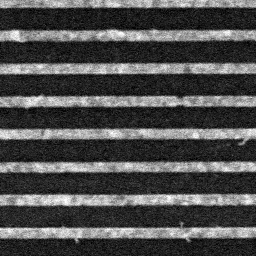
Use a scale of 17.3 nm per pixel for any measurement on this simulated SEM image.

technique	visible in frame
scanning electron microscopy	parallel lines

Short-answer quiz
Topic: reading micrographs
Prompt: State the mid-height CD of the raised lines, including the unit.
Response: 162 nanometres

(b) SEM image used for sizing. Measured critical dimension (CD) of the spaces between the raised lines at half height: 404 nanometers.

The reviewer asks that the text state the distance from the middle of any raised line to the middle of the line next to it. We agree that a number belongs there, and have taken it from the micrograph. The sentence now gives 569 nanometres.